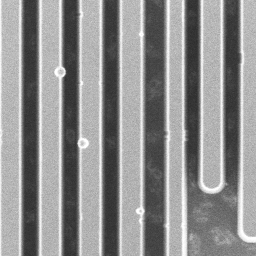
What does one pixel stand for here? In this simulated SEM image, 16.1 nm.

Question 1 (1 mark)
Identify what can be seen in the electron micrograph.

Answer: parallel lines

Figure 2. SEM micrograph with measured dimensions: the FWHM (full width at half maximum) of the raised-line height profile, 395 nm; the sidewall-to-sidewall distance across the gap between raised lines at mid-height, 255 nanometers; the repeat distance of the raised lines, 40.7 px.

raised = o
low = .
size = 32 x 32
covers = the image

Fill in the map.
ooo..ooo..ooo..ooo...oo..ooo..oo
ooo..ooo..ooo..ooo...oo..ooo..oo
ooo..ooo..ooo..ooo...oo..ooo..oo
ooo..ooo..ooo..ooo...oo..ooo..oo
ooo..ooo..ooo..ooo...oo..ooo..oo
ooo..ooo..ooo..ooo...oo..ooo..oo
ooo..ooo..ooo..ooo...oo..ooo..oo
ooo..ooo..ooo..ooo...oo..ooo..oo
ooo..ooo..ooo..ooo...oo..ooo..oo
ooo..ooo..ooo..ooo...oo..ooo..oo
ooo..ooo..ooo..ooo...oo..ooo..oo
ooo..ooo..ooo..ooo...oo..ooo..oo
ooo..ooo..ooo..ooo...oo..ooo..oo
ooo..ooo..ooo..ooo...oo..ooo..oo
ooo..ooo..ooo..ooo...oo..ooo..oo
ooo..ooo..ooo..ooo...oo..ooo..oo
ooo..ooo..ooo..ooo...oo..ooo..oo
ooo..ooo..ooo..ooo...oo..ooo..oo
ooo..ooo..ooo..ooo...oo..ooo..oo
ooo..ooo..ooo..ooo...oo..ooo..oo
ooo..ooo..ooo..ooo...oo..ooo..oo
ooo..ooo..ooo..ooo...oo..ooo..oo
ooo..ooo..ooo..ooo...oo..ooo..oo
ooo..ooo..ooo..ooo...oo..ooo..oo
ooo..ooo..ooo..ooo...oo.......oo
ooo..ooo..ooo..ooo...oo.......oo
ooo..ooo..ooo..ooo...oo.......oo
ooo..ooo..ooo..ooo...oo.......oo
ooo..ooo..ooo..ooo...oo.......oo
ooo..ooo..ooo..ooo...oo.......oo
ooo..ooo..ooo..ooo...oo.........
ooo..ooo..ooo..ooo...oo.........